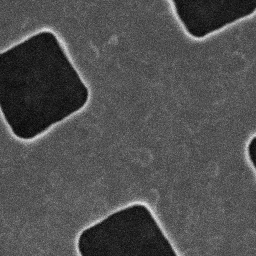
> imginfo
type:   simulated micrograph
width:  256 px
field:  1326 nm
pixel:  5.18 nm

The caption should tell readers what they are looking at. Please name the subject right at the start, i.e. holes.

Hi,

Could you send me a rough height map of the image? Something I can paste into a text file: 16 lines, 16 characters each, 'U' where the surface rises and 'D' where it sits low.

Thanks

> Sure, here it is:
UUUUUUUUUUUDDDDD
UUUUUUUUUUUDDDUU
UUDDUUUUUUUUUUUU
DDDDUUUUUUUUUUUU
DDDDDUUUUUUUUUUU
DDDDDUUUUUUUUUUU
DDDDDUUUUUUUUUUU
DDDDUUUUUUUUUUUU
UDUUUUUUUUUUUUUU
UUUUUUUUUUUUUUUU
UUUUUUUUUUUUUUUU
UUUUUUUUUUUUUUUU
UUUUUUUUUUUUUUUU
UUUUUUUDDDUUUUUU
UUUUUDDDDDUUUUUU
UUUUUDDDDDDUUUUU